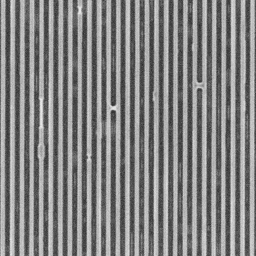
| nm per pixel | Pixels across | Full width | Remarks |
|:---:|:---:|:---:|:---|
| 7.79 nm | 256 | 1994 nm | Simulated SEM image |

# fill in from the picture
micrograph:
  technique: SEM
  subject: parallel lines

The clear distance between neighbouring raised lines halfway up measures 45.7 nm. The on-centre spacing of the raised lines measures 74.8 nanometers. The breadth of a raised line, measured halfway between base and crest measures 0.0302 micrometres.